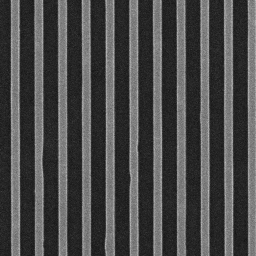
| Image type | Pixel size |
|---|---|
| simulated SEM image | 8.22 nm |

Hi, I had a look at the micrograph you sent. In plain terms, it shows parallel lines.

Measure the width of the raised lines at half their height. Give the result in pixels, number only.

8.25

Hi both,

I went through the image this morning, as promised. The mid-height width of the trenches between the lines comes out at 129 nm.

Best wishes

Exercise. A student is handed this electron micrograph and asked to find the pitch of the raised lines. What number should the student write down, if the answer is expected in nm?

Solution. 195